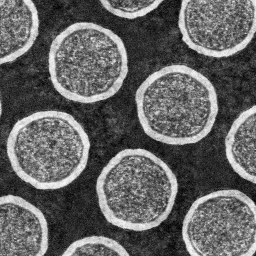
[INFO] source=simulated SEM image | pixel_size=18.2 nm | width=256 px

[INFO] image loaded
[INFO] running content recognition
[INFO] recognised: raised bodies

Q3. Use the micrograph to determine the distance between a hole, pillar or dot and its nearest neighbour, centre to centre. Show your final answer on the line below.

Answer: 1.71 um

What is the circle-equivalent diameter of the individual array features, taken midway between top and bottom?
74.4 pixels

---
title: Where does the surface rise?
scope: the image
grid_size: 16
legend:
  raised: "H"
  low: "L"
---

HHLLLLLHHLLHHHHH
HHLLLLLLLLLHHHHH
HHLLHHHLLLLLHHHL
HLLHHHHHLLLLLLLL
LLLHHHHHLLHHLLLL
LLLLHHHLLHHHHLLL
LLLLLLLLLHHHHLLL
LLHHLLLLLHHHHLLH
LHHHHLLLLLHHLLHH
LHHHHLLLLLLLLLHH
LHHHHLLHHHLLLLLH
LLHHLLHHHHHLLLLL
LLLLLLHHHHHLLHHL
HHLLLLLHHHLLHHHH
HHHLLLLLLLLLHHHH
HHHLLHHLLLLLHHHH